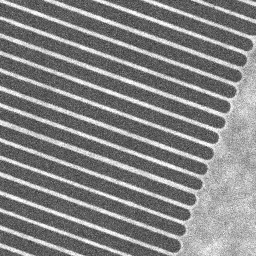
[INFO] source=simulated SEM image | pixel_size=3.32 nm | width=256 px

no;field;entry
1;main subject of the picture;parallel lines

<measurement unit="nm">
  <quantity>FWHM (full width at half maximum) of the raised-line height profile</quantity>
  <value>12.9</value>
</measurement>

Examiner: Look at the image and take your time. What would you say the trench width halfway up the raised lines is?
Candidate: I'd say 0.0422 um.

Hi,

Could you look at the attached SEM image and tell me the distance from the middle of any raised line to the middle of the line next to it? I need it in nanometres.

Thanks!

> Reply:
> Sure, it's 54.7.